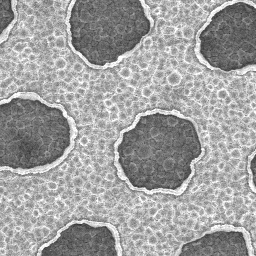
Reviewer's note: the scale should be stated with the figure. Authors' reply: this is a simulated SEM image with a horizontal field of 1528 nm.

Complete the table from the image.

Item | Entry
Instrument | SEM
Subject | holes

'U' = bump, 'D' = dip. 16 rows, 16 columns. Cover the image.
DUUUUDDDDUUUUUDD
DUUUDDDDDUUUUDDD
UUUUDDDDDUUUUDDD
UUUUUDDDUUUUUDDD
UUUUUUUUUUUUUUUU
UUUUUUUUUUUUUUUU
DDDUUUUUUUUUUUUU
DDDDUUUUUDDDUUUU
DDDDUUUUDDDDUUUU
DDDDUUUDDDDDDUUU
UDUUUUUUDDDDUUUU
UUUUUUUUDDDUUUUU
UUUUUUUUUUUUUUUU
UUUUUUUUUUUUUUUU
UUUUDDDUUUUUUDDU
UUUDDDDUUUUDDDDD